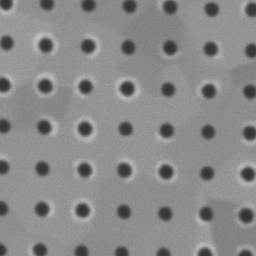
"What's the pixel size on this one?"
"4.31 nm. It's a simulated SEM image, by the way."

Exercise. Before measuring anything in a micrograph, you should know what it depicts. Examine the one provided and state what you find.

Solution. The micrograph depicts a regular array of holes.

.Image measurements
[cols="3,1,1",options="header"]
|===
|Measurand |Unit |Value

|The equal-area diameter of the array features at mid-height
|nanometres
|64.3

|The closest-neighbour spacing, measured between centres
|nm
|174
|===